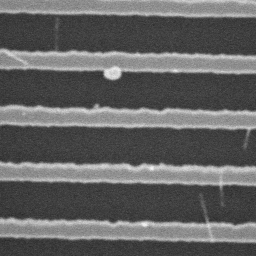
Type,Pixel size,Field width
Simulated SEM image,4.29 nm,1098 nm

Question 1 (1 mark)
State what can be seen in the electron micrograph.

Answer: lines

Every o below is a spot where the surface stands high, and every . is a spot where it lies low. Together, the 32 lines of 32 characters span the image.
oooooooooooooooooooooooooooooooo
.ooooooooooooooooooooooooooooooo
................................
................................
................................
................................
ooooo.o.ooo...o.................
oooooooooooooooooooooooooooooooo
oooooooooooooooooooooooooooooooo
.............oo.................
................................
................................
................................
oooooo.......o..................
oooooooooooooooooooooooooooooooo
oooooooooooooooooooooooooooooooo
................................
................................
................................
................................
ooooooooo.......................
oooooooooooooooooooooooooooooooo
oooooooooooooooooooooooooooooooo
................................
................................
................................
................................
oooooo.o.o......................
oooooooooooooooooooooooooooooooo
oooooooooooooooooooooooooooooooo
................................
................................